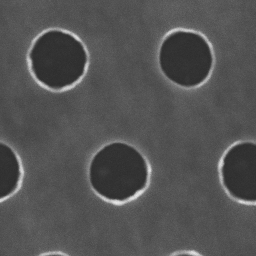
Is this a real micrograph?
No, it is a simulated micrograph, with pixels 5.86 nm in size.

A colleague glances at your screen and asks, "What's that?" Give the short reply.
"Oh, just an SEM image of holes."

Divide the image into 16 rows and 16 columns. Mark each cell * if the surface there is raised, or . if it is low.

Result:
****************
****************
**...*****...***
**...*****...***
**...*****...***
****************
****************
****************
****************
.*****...*****..
.*****...*****..
.*****...*****..
***************.
****************
****************
****************